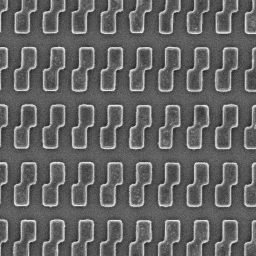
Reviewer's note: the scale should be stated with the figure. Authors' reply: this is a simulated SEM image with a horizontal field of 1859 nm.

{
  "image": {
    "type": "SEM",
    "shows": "wiring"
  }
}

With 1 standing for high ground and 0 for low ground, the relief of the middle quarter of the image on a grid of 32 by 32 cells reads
00001110000111000011110001111000
00011100001110000111100011110001
00111100011110001111000011100001
00111100011110001111000011100001
00111100011110000111000011100001
00111100011110000111000011100001
00111000001100000111000011100001
00000000000000000000000000000000
00000000000000000000000000000000
00000000000000000000000000000000
00001110000111000001100000110000
00001110000111000011110001111000
00001110000111000011110001111000
00001110000111000011110001111000
00001110000111000011110001111000
00001110000111000011100001111000
00111100011110000111000011100001
00111000011110000111000011100001
00111000011110001111000011100001
00111000011110001111000011100001
00111000011110001111000011100001
00000000000000000000000000000000
00000000000000000000000000000000
00000000000000000000000000000000
00000000000000000000000000000000
00001110000111000011110001111000
00001110000111000011110001111000
00001110000111000011110001111000
00001110000111000011110001111000
00001110000111000011110001111000
00111100011110000111000011100001
00111000011110001111000011100001